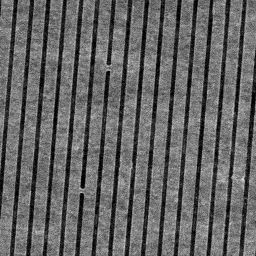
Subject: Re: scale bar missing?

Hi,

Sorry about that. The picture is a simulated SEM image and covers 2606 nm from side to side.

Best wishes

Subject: parallel lines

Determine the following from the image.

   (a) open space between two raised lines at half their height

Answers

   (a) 52 nanometres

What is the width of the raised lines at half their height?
11.1 pixels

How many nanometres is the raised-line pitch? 166